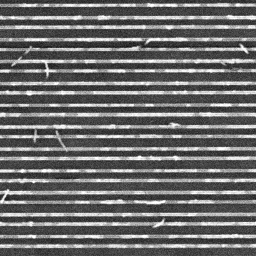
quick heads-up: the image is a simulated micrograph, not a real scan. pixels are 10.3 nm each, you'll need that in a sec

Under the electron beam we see parallel lines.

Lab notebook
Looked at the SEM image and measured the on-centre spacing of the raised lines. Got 0.113 microns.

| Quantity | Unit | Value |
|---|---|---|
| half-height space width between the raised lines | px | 7.51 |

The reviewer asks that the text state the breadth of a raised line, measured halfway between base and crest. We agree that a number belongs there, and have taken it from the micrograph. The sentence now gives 0.0283 micrometres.